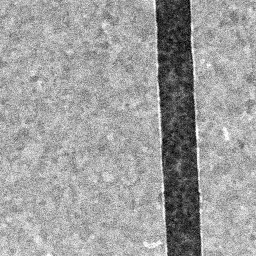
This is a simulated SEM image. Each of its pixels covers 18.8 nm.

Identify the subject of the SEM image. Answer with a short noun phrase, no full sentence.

one or a few lines or trenches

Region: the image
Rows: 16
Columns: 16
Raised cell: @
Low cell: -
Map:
@@@@@@@@@@--@@@@
@@@@@@@@@@--@@@@
@@@@@@@@@@--@@@@
@@@@@@@@@@--@@@@
@@@@@@@@@@--@@@@
@@@@@@@@@@--@@@@
@@@@@@@@@@--@@@@
@@@@@@@@@@--@@@@
@@@@@@@@@@--@@@@
@@@@@@@@@@--@@@@
@@@@@@@@@@--@@@@
@@@@@@@@@@--@@@@
@@@@@@@@@@---@@@
@@@@@@@@@@---@@@
@@@@@@@@@@---@@@
@@@@@@@@@@---@@@